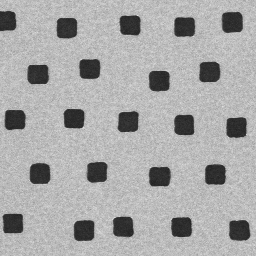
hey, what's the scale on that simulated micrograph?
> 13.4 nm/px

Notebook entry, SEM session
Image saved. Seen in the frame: a regular array of holes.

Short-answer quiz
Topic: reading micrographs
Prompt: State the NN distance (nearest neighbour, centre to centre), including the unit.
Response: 691 nm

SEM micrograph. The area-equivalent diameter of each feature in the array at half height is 0.295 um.